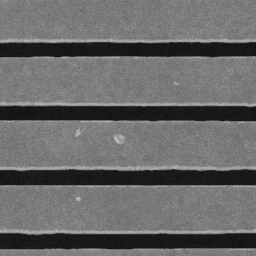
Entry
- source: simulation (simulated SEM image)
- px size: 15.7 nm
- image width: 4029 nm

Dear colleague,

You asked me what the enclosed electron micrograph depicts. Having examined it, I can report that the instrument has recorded lines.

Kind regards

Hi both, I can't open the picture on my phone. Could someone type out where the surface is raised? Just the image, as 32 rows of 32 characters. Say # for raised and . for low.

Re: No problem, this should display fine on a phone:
################################
################################
################################
################################
################################
................................
................................
################################
################################
################################
################################
################################
################################
................................
................................
################################
################################
################################
################################
################################
################################
................................
................................
################################
################################
################################
################################
################################
################################
................................
................................
################################